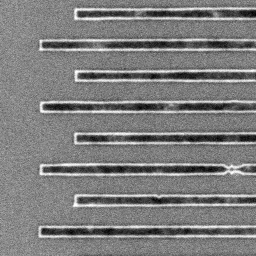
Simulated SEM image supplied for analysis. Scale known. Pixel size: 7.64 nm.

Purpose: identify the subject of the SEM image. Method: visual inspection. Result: parallel lines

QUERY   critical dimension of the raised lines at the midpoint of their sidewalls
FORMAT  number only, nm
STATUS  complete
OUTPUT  78.4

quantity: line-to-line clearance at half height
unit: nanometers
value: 163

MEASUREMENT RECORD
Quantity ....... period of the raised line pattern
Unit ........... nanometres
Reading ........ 238